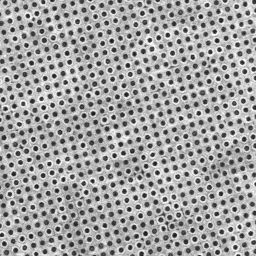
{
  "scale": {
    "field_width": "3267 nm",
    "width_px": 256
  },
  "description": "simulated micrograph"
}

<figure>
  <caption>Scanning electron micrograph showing a regular array of holes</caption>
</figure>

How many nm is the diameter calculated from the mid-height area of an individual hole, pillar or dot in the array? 70.5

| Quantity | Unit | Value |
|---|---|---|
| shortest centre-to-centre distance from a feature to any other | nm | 116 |